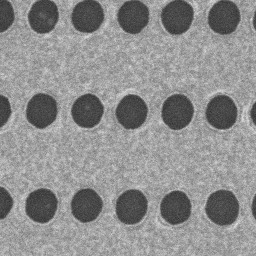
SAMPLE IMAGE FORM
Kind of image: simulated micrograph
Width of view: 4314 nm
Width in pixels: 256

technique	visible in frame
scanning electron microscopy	a regular array of holes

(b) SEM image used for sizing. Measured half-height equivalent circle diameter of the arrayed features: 578 nm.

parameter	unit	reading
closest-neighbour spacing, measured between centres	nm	745